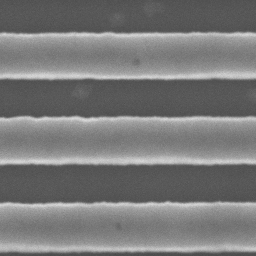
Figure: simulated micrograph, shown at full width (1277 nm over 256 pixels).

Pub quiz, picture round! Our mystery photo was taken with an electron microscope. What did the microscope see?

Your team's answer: lines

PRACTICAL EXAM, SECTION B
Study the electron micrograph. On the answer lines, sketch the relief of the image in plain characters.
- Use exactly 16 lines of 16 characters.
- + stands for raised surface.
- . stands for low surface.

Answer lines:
................
................
++++++++++++++++
++++++++++++++++
++++++++++++++++
................
................
++++++++++++++++
++++++++++++++++
++++++++++++++++
................
................
................
++++++++++++++++
++++++++++++++++
++++++++++++++++